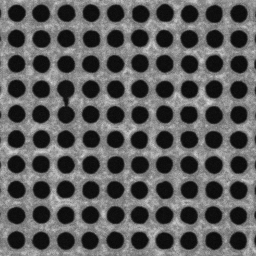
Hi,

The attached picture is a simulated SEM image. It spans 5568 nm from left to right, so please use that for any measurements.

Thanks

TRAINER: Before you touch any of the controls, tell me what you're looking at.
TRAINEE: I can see a regular array of holes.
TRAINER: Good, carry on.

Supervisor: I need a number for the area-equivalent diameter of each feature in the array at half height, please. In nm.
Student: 395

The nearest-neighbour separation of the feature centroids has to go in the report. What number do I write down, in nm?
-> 531